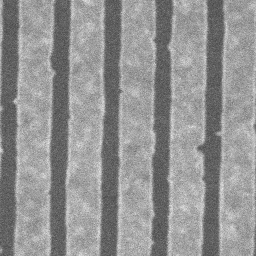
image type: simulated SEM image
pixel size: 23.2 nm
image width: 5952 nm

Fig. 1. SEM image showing parallel lines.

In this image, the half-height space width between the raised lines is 439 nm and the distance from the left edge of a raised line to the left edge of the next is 1.19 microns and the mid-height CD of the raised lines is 744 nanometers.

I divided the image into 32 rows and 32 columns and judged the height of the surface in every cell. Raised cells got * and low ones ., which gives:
...****..****..****...****..****
...****..****..****...****..****
...****..****..****...****..****
...****..****..****...****..****
..****...****..****...****..****
...***...****..****..*****..****
...***...****..****..*****..****
...***...****..****...****..****
...***...****..****...****..****
..*****..****..****...****..****
..****...****..****...****..****
..****...****..****...***...****
..****...****..****...***...****
..****...****..****...***...****
..****...****..****...***...****
..****...****..****...***...****
..****...****..****..****...****
..****...****..****..****...****
..****...***...****..****...****
..****...***...****..****...****
..****...***...****..****...****
..****...****..****..****...****
..****..****...****..****...****
..****..****...****..****...****
..****..****...****..****...****
..****..*****..****..****...****
..****..****...****..****...****
..****..****...****..****...****
..****..****...****..****...****
..****..****...****..****...****
..****..****...****..****...****
..****...***...****..****...****